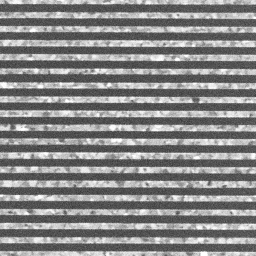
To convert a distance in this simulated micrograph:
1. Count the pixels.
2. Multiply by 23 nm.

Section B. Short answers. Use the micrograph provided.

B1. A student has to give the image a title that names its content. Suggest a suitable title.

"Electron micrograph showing parallel lines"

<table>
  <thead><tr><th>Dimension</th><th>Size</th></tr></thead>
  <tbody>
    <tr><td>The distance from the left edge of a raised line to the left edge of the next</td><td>14.1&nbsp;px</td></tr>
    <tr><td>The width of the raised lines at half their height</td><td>121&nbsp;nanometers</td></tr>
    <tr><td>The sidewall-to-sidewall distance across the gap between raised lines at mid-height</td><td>204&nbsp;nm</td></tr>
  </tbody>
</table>